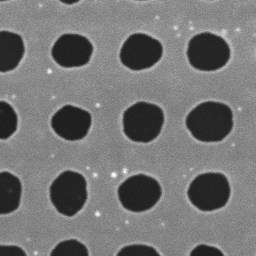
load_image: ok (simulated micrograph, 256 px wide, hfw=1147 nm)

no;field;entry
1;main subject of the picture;a regular array of holes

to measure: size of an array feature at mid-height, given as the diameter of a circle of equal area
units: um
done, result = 0.183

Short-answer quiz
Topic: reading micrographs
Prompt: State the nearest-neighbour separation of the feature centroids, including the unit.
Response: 308 nanometers